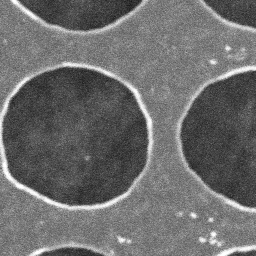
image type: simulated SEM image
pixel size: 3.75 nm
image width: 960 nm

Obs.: holes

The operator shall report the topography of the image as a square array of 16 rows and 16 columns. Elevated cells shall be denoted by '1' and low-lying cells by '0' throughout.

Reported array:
1100000011111000
1110000111111110
1111111111111111
1111111111111111
1110001111111110
1000000011111000
1000000001110000
0000000001100000
0000000001100000
0000000001100000
0000000001110000
1000000011111000
1110000111111100
1111111111111111
1111111111111111
1111011111111111